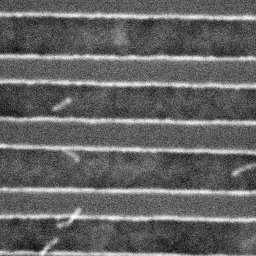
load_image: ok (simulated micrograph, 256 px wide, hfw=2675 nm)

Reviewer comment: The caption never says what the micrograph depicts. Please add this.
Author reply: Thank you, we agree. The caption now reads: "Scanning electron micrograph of lines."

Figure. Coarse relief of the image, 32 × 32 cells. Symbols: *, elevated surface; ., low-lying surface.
********************************
********************************
................................
................................
................................
................................
................................
********************************
********************************
********************************
............********************
................................
................................
................................
................................
********************************
********************************
********************************
.....***************************
................................
................................
................................
................................
................................
********************************
********************************
********************************
.........................*******
................................
................................
................................
................................